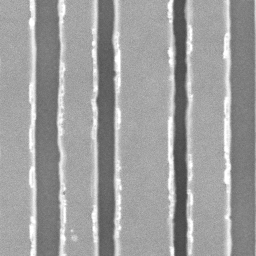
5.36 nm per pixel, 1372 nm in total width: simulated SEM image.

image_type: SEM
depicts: one or a few lines or trenches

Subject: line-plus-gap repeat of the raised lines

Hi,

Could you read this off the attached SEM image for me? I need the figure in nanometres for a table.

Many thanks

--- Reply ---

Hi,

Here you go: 348